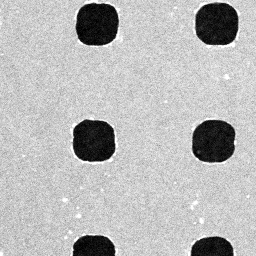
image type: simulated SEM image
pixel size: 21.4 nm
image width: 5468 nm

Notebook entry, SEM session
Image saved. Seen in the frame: holes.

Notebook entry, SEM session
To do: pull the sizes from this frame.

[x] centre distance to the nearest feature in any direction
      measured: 2500 nm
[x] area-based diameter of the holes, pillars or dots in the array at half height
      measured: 959 nanometers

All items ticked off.